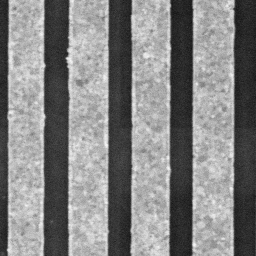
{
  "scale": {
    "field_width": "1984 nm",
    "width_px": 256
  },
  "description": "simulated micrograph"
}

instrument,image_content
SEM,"one or a few lines or trenches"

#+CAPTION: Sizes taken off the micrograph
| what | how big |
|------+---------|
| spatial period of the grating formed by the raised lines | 484 nm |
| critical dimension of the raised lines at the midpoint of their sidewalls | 287 nanometers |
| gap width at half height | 0.201 um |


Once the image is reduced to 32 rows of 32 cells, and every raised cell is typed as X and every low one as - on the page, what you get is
-XXXX----XXXX----XXXX---XXXXX---
-XXXX----XXXX----XXXX---XXXXX---
-XXXX----XXXX----XXXX---XXXXX---
-XXXX----XXXX----XXXX---XXXXX---
-XXXX----XXXX----XXXX---XXXXX---
-XXXX----XXXX----XXXX---XXXXX---
-XXXX---XXXXX----XXXX---XXXXX---
-XXXX---XXXXX----XXXX---XXXXX---
-XXXX----XXXX----XXXX---XXXXX---
-XXXX----XXXX----XXXX---XXXXX---
-XXXX----XXXX----XXXX---XXXXX---
-XXXX----XXXX----XXXX---XXXXX---
-XXXX----XXXX----XXXX---XXXXX---
-XXXX----XXXX----XXXX---XXXXX---
-XXXX----XXXX----XXXX---XXXXX---
-XXXX----XXXX----XXXX---XXXXX---
-XXXX----XXXX----XXXX---XXXXX---
-XXXX----XXXX----XXXX---XXXXX---
-XXXX----XXXX----XXXX---XXXXX---
-XXXX----XXXX----XXXX---XXXXX---
-XXXX----XXXX----XXXX---XXXXX---
-XXXX----XXXX----XXXX---XXXXX---
-XXXX----XXXX----XXXX---XXXXX---
-XXXX----XXXX----XXXX---XXXXX---
-XXXX----XXXX----XXXX---XXXXX---
-XXXX----XXXX----XXXX---XXXXX---
-XXXX----XXXX----XXXX---XXXXX---
-XXXX----XXXX----XXXX---XXXXX---
-XXXX----XXXX---XXXXX---XXXXX---
-XXXX----XXXX----XXXX---XXXXX---
-XXXX----XXXX----XXXX---XXXXX---
-XXXX----XXXX----XXXX---XXXXX---